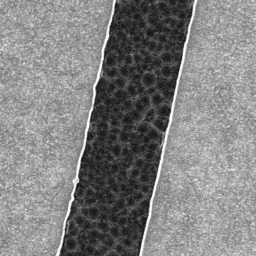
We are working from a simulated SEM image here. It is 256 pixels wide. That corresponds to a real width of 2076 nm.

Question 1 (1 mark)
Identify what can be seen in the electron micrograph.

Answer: one or a few lines or trenches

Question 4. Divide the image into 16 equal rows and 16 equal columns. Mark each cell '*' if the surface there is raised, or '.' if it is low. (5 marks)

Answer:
*******.....****
*******.....****
*******.....****
******.....*****
******.....*****
******.....*****
******.....*****
******.....*****
*****.....******
*****.....******
*****.....******
*****.....******
****.....*******
****.....*******
****.....*******
****.....*******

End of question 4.